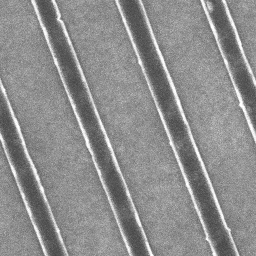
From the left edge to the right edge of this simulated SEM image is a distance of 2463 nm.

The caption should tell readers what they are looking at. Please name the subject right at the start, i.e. one or a few lines or trenches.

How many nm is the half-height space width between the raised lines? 545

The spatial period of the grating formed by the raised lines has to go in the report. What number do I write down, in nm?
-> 761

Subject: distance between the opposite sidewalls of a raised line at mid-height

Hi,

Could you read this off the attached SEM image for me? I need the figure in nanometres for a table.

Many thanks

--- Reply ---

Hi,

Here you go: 211